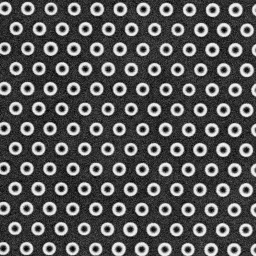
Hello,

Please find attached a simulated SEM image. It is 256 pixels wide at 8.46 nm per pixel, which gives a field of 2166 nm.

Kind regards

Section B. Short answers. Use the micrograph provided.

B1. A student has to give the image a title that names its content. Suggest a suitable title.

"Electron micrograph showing an array of small figures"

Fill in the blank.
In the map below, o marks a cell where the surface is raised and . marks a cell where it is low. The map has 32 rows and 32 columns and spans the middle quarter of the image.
o...ooo...oo...ooo...ooo...ooo..
o...ooo...ooo..ooo...ooo...ooo..
....oo....oo....oo....oo...oo...
................................
................................
.ooo...ooo...oo...ooo...ooo...oo
.ooo...ooo..oooo..ooo...ooo...oo
.oo....oo....oo....oo....o....oo
................................
................................
o...ooo...oo....oo...ooo...oo...
o...ooo...oo...ooo...ooo...ooo..
....oo....oo....oo...ooo...oo...
................................
................................
.ooo...oo....oo...ooo...ooo...oo
.ooo...ooo..ooo...ooo...ooo...oo
.oo....oo....oo....oo...ooo...oo
................................
................................
o...ooo...oo...ooo...ooo...ooo..
o...ooo..ooo...ooo...ooo...ooo..
....oo....oo....oo....oo...oo...
................................
................................
.ooo...oo...ooo...ooo...ooo...oo
.ooo..ooo...ooo...ooo...ooo...oo
.oo....oo....oo....oo...oo....oo
................................
................................
o...oo....oo...ooo...ooo...oo...
o...ooo..ooo...ooo...ooo...ooo..